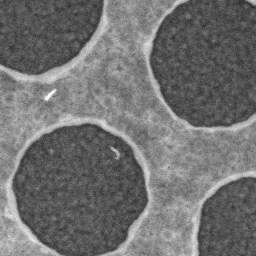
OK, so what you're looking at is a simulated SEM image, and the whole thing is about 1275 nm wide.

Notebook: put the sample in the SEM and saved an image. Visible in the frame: holes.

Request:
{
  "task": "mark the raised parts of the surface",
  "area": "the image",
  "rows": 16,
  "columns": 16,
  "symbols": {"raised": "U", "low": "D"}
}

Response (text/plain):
DDDDDDUUUUUDDDDD
DDDDDDUUUUDDDDDD
DDDDDDUUUUDDDDDD
DDDDDUUUUDDDDDDD
UDDUUUUUUDDDDDDD
UUUUUUUUUUDDDDDD
UUUUUUUUUUDDDDDD
UUUUUUUUUUUDDDDD
UUDDDDDDUUUUUUUU
UDDDDDDDUUUUUUUU
UDDDDDDDDUUUUUUU
UDDDDDDDDUUUUUDD
UDDDDDDDDUUUUDDD
UDDDDDDDDUUUDDDD
UUDDDDDDUUUUDDDD
UUUDDDDUUUUUDDDD